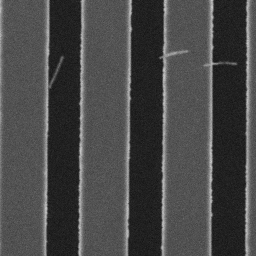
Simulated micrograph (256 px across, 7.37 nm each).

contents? lines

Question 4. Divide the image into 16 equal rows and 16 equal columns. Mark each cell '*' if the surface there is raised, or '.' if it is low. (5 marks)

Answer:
***..***..***..*
***..***..***..*
***..***..***..*
***..***..***..*
***..***..***..*
***..***..***..*
***..***..***..*
***..***..***..*
***..***..***..*
***..***..***..*
***..***..***..*
***..***..***..*
***..***..***..*
***..***..***..*
***..***..***..*
***..***..***..*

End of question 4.